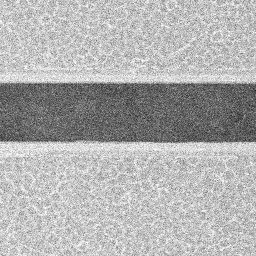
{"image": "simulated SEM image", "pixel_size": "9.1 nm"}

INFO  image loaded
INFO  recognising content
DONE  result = one or a few lines or trenches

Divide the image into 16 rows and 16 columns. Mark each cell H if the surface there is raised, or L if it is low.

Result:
HHHHHHHHHHHHHHHH
HHHHHHHHHHHHHHHH
HHHHHHHHHHHHHHHH
HHHHHHHHHHHHHHHH
HHHHHHHHHHHHHHHH
LLLLLLLLLLLLLLLL
LLLLLLLLLLLLLLLL
LLLLLLLLLLLLLLLL
LLLLLLLLLLLLLLLL
HHHHHHHHHHHHHHHH
HHHHHHHHHHHHHHHH
HHHHHHHHHHHHHHHH
HHHHHHHHHHHHHHHH
HHHHHHHHHHHHHHHH
HHHHHHHHHHHHHHHH
HHHHHHHHHHHHHHHH